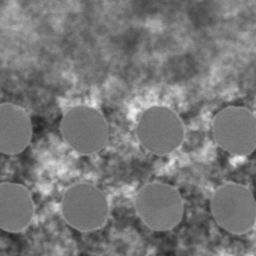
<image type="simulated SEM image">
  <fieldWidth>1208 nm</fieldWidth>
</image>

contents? raised bodies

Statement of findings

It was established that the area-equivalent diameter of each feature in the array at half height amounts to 48.5 pixels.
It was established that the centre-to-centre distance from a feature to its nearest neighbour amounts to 0.354 um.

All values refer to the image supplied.